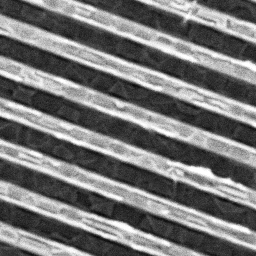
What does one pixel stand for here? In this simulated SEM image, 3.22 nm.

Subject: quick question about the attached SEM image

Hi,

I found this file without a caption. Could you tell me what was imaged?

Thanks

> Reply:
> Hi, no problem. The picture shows parallel lines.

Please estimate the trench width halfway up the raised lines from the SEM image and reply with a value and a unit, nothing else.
0.0688 micrometres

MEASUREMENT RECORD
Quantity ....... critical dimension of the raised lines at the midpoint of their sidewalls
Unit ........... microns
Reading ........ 0.0567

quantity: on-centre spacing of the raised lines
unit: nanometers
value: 125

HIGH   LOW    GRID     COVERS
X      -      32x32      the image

----XXXXXXX-------XXXXXXX-------
-------XXXXXX--------XXXXXX-----
XX--------XXXXXX-------XXXXXXX--
XXXXX-------XXXXXXX--------XXXXX
-XXXXXX--------XXXXXX--------XXX
----XXXXXX--------XXXXXX--------
------XXXXXXX--------XXXXXX-----
XX-------XXXXXX--------XXXXXXX--
XXXX--------XXXXXX--------XXXXXX
-XXXXXX--------XXXXXX--------XXX
---XXXXXXX-------XXXXXXX--------
------XXXXXX--------XXXXXXX-----
X--------XXXXXX--------XXXXXX---
XXXX--------XXXXXX-------XXXXXXX
XXXXXX--------XXXXXXX-------XXXX
---XXXXXX--------XXXXXX--------X
-----XXXXXXX--------XXXXXX------
--------XXXXXXX-------XXXXXXX---
XXX--------XXXXXX--------XXXXXX-
XXXXXX--------XXXXXX--------XXXX
--XXXXXXX--------XXXXXX--------X
-----XXXXXX--------XXXXXXX------
--------XXXXXX--------XXXXXXX---
XXX-------XXXXXXX--------XXXXXX-
XXXXX--------XXXXXX---------XXXX
--XXXXXX--------XXXXXX--------XX
----XXXXXXX--------XXXXXX-------
-------XXXXXXX-------XXXXXXX----
XX--------XXXXXXX-------XXXXXXX-
XXXXX--------XXXXXX--------XXXXX
-XXXXXX--------XXXXXXX--------XX
----XXXXXX--------XXXXXX--------